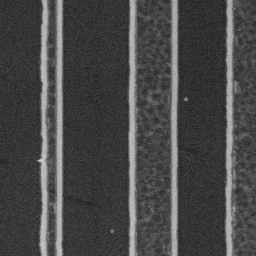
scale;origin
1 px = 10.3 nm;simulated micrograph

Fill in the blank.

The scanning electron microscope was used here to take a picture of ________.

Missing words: one or a few lines or trenches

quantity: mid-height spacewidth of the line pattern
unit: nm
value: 647